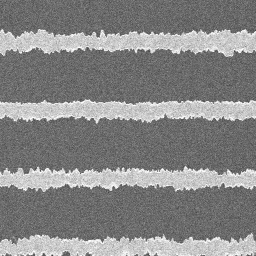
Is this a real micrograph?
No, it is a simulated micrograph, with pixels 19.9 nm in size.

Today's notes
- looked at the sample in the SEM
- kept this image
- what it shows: one or a few lines or trenches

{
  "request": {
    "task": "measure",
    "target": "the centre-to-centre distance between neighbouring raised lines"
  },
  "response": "1360 nanometres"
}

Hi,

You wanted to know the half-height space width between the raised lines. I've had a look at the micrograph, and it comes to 1040 nm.